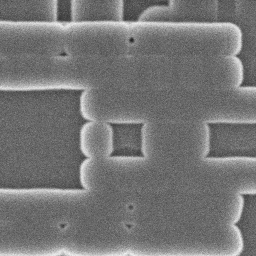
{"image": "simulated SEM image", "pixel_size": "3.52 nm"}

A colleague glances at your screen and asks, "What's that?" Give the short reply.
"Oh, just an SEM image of wiring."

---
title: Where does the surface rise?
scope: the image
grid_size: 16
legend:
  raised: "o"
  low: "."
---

................
ooooooooooooo...
ooooooooooooooo.
ooooooooooooooo.
ooooooooooooooo.
oooooooooooooooo
.....ooooooooooo
.....ooooooooooo
.....oo..oooo...
.....oo..oooo...
.....ooooooooooo
.....ooooooooooo
ooooooooooooooo.
ooooooooooooooo.
ooooooooooooooo.
ooooooooooooooo.